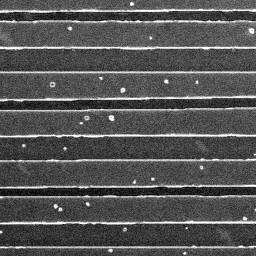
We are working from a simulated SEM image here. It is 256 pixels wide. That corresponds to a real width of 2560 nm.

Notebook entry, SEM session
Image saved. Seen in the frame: lines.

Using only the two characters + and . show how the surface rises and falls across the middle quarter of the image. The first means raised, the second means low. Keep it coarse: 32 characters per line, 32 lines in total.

................................
................................
++++++++++++++++++++++++++++++++
++++++++++++++++++++++++++++++++
++++++++++++++++++++++++++++++++
++++++++++++++++++++++++++++++++
++++++++++++++++++++++++++++++++
++++++++++++++++++++++++++++++++
++++++++++++++++++++............
................................
................................
..............................++
++++++++++++++++++++++++++++++++
++++++++++++++++++++++++++++++++
++++++++++++++++++++++++++++++++
++++++++++++++++++++++++++++++++
++++++++++++++++++++++++++++++++
++++++++++++++++++++++++++++++++
................................
................................
................................
................................
................................
................................
++++++++++++++++++++++++++++++++
++++++++++++++++++++++++++++++++
++++++++++++++++++++++++++++++++
++++++++++++++++++++++++++++++++
++++++++++++++++++++++++++++++++
++++++++++++++++++++++++++++++++
+++++++++++++++++++++++.........
................................